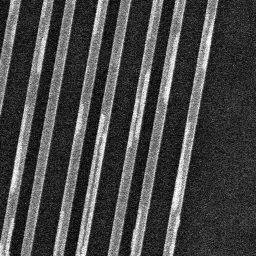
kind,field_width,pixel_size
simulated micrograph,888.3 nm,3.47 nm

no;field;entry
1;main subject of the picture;parallel lines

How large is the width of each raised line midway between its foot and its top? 33.8 nm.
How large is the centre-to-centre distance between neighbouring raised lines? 94.5 nm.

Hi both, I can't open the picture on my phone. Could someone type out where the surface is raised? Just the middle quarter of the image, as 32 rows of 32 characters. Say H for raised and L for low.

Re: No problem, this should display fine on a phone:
LLLLLLHHLLLHHHLLLLLLHHLLLHHLLLLL
LLLLLLHHLLLHHLLLLLLHHHLLLHHLLLLL
LLLLLHHHLLLHHLLLLLLHHLLLLHHLLLLL
LLLLLHHHLLLHHLLLLLLHHLLLHHHLLLLL
LLLLLHHLLLLHHLLLLLLHHLLLHHHLLLLL
LLLLLHHLLLLHHLLLLLLHHLLLHHLLLLLL
LLLLLHHLLLHHLLLLLLLHHLLLHHLLLLLL
LLLLLHHLLLHHLLLLLLHHLLLLHHLLLLLL
LLLLHHHLLLHHLLLLLLHHLLLLHHLLLLLL
LLLLHHHLLLHHLLLLLLHHLLLHHHLLLLLL
LLLLHHLLLLHHLLLLLLHHLLLHHHLLLLLH
LLLLHHLLLHHHLLLLLLHHLLLHHLLLLLLH
LLLLHHLLLHHLLLLLLHHHLLLHHLLLLLLH
LLLHHHLLLHHLLLLLLHHLLLLHHLLLLLLH
LLLHHHLLLHHLLLLLLHHLLLLHHLLLLLLH
LLLHHLLLLHHLLLLLLHHLLLHHHLLLLLLH
LLLHHLLLLHHLLLLLLHHLLLHHHLLLLLHH
LLLHHLLLHHHLLLLLLHHLLLHHLLLLLLHH
LLLHHLLLHHLLLLLLHHLLLLHHLLLLLLHH
LLHHHLLLHHLLLLLLHHLLLLHHLLLLLLHH
LLHHHLLLHHLLLLLLHHLLLHHHLLLLLLHH
LLHHLLLLHHLLLLLLHHLLLHHHLLLLLHHH
LLHHLLLLHHLLLLLLHHLLLHHLLLLLLHHH
LLHHLLLHHLLLLLLLHHLLLHHLLLLLLHHL
LHHHLLLHHLLLLLLHHLLLLHHLLLLLLHHL
LHHHLLLHHLLLLLLHHLLLLHHLLLLLLHHL
LHHLLLLHHLLLLLLHHLLLHHHLLLLLLHHL
LHHLLLLHHLLLLLLHHLLLHHHLLLLLHHHL
LHHLLLHHHLLLLLLHHLLLHHLLLLLLHHHL
LHHLLLHHLLLLLLHHHLLLHHLLLLLLHHLL
HHHLLLHHLLLLLLHHLLLLHHLLLLLLHHLL
HHHLLLHHLLLLLLHHLLLLHHLLLLLLHHLL